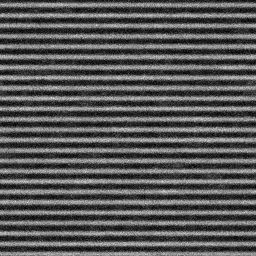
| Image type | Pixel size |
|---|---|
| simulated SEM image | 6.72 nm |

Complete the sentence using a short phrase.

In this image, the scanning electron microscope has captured parallel lines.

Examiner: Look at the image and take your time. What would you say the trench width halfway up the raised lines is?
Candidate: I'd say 0.0512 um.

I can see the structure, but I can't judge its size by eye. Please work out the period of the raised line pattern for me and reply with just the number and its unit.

0.0697 microns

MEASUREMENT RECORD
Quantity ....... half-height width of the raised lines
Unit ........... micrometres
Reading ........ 0.0227